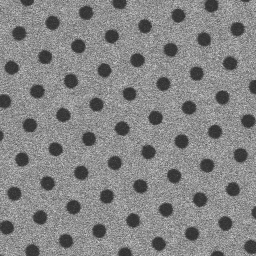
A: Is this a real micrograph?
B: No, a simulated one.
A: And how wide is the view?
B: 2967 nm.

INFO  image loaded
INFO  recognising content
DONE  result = a regular array of holes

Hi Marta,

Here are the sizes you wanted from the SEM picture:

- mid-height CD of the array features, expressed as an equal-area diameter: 160 nanometres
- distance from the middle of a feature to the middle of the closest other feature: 402 nanometers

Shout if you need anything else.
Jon